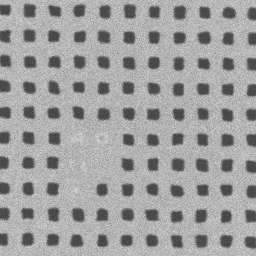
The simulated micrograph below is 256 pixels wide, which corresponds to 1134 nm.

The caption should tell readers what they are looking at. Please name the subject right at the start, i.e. a regular array of holes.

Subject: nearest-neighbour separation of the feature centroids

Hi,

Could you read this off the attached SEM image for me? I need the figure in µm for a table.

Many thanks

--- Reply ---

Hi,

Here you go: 0.108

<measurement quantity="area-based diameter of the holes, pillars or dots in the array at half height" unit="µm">0.057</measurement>